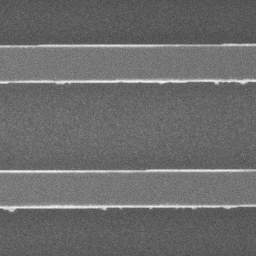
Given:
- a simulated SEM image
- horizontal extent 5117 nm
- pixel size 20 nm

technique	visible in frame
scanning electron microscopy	lines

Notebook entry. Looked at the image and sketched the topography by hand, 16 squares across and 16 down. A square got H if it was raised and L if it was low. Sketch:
LLLLLLLLLLLLLLLL
LLLLLLLLLLLLLLLL
LLLLLLLLLLLLLLLL
HHHHHHHHHHHHHHHH
HHHHHHHHHHHHHHHH
LLLLLLLLLLLLLLLL
LLLLLLLLLLLLLLLL
LLLLLLLLLLLLLLLL
LLLLLLLLLLLLLLLL
LLLLLLLLLLLLLLLL
LLLLLLLLLLLLLLLL
HHHHHHHHHHHHHHHH
HHHHHHHHHHHHHHHH
LLLLLLLLLLLLLLLL
LLLLLLLLLLLLLLLL
LLLLLLLLLLLLLLLL